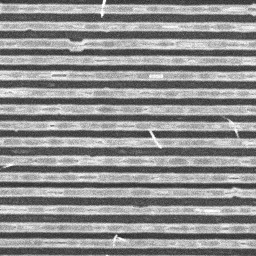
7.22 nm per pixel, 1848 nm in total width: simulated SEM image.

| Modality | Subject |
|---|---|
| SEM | parallel lines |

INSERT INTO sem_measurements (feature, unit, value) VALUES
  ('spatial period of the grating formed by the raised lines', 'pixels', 16.7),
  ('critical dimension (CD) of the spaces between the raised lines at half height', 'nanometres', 61.4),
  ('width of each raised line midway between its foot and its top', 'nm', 61.4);